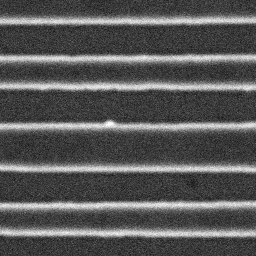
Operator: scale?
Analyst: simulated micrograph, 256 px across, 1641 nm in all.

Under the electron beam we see lines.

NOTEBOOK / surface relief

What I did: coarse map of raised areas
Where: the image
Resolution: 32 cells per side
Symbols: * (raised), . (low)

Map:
********************************
********************************
********************************
................................
................................
................................
................................
********************************
********************************
********************************
********************************
................................
................................
................................
................................
.............*................**
********************************
********************************
********************************
********************************
********************************
................................
................................
................................
................................
......***..*********************
********************************
********************************
********************************
................................
................................
................................